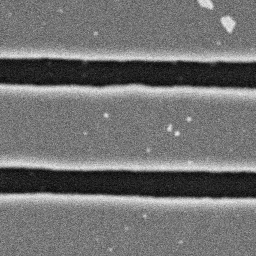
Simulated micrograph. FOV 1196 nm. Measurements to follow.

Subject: lines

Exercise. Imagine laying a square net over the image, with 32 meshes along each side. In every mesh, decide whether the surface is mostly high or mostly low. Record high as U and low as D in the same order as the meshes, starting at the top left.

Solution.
UUUUUUUUUUUUUUUUUUUUUUUUUUUUUUUU
UUUUUUUUUUUUUUUUUUUUUUUUUUUUUUUU
UUUUUUUUUUUUUUUUUUUUUUUUUUUUUUUU
UUUUUUUUUUUUUUUUUUUUUUUUUUUUUUUU
UUUUUUUUUUUUUUUUUUUUUUUUUUUUUUUU
UUUUUUUUUUUUUUUUUUUUUUUUUUUUUUUU
UUUUUUUUUUUUUUUUUUUUUUUUUUUUUUUU
DDDDDDDDDDDUUDUUUUUUUUUUUUUUUUUU
DDDDDDDDDDDDDDDDDDDDDDDDDDDDDDDD
DDDDDDDDDDDDDDDDDDDDDDDDDDDDDDDD
DDDDDDDDDDDDDDDDDDDDDDDDDDDDDDDD
UUUUUUUUUUUUUUUUUUUUUUUUUUUUUUUU
UUUUUUUUUUUUUUUUUUUUUUUUUUUUUUUU
UUUUUUUUUUUUUUUUUUUUUUUUUUUUUUUU
UUUUUUUUUUUUUUUUUUUUUUUUUUUUUUUU
UUUUUUUUUUUUUUUUUUUUUUUUUUUUUUUU
UUUUUUUUUUUUUUUUUUUUUUUUUUUUUUUU
UUUUUUUUUUUUUUUUUUUUUUUUUUUUUUUU
UUUUUUUUUUUUUUUUUUUUUUUUUUUUUUUU
UUUUUUUUUUUUUUUUUUUUUUUUUUUUUUUU
UUUUUUUUUUUUUUUUUUUUUUUUUUUUUUUU
DDDDDDDDDDDDDDDDDDDDDDDDDDDDDDDU
DDDDDDDDDDDDDDDDDDDDDDDDDDDDDDDD
DDDDDDDDDDDDDDDDDDDDDDDDDDDDDDDD
UUUUUUUUUUUUUUUDDDDDDDDDDDDDDDDD
UUUUUUUUUUUUUUUUUUUUUUUUUUUUUUUU
UUUUUUUUUUUUUUUUUUUUUUUUUUUUUUUU
UUUUUUUUUUUUUUUUUUUUUUUUUUUUUUUU
UUUUUUUUUUUUUUUUUUUUUUUUUUUUUUUU
UUUUUUUUUUUUUUUUUUUUUUUUUUUUUUUU
UUUUUUUUUUUUUUUUUUUUUUUUUUUUUUUU
UUUUUUUUUUUUUUUUUUUUUUUUUUUUUUUU